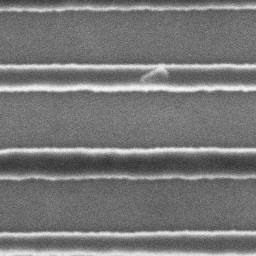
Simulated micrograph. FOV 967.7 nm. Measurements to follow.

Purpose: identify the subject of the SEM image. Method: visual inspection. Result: lines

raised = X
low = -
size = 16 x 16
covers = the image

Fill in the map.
XXXXXXXXXXXXXXXX
----------------
----------------
----------------
XXXXXXXXXXXXXXXX
XXXXXXXXXXXXXXXX
----------------
----------------
----------------
XXXXXXXXXXXXXXXX
XXXXXXXXXXXXXXXX
----------------
----------------
----------------
-----------X-XXX
XXXXXXXXXXXXXXXX